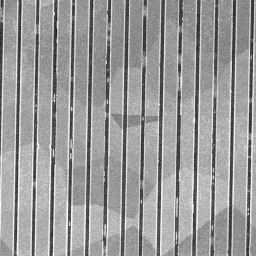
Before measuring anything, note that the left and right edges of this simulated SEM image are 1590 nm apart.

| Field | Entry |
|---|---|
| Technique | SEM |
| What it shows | parallel lines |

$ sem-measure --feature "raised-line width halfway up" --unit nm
86.2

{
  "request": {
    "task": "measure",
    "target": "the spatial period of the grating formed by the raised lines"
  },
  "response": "111 nm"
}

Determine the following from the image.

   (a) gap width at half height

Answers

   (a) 27.2 nanometers